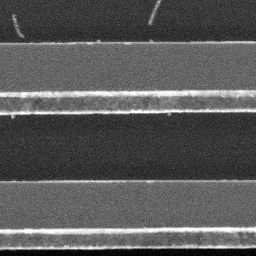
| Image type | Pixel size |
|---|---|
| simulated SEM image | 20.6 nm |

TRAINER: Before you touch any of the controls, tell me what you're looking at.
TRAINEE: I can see lines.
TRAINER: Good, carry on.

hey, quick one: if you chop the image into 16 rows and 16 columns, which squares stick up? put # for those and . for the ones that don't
................
................
................
################
################
################
################
................
................
................
................
################
################
################
################
#######.........